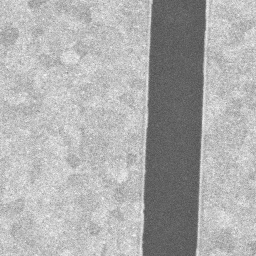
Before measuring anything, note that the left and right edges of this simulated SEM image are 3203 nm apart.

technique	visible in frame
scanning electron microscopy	one or a few lines or trenches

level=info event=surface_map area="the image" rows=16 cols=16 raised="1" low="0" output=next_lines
1111111110000111
1111111110000111
1111111110000111
1111111110000111
1111111110000111
1111111110000111
1111111110000111
1111111110000111
1111111110000111
1111111110000111
1111111110000111
1111111110000111
1111111110000111
1111111110001111
1111111110001111
1111111110001111